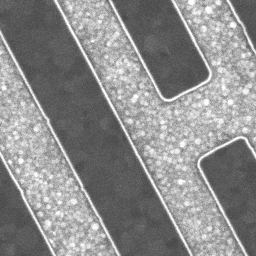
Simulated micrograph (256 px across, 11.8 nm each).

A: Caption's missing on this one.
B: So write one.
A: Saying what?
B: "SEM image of one or a few lines or trenches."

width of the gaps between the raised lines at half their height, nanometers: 566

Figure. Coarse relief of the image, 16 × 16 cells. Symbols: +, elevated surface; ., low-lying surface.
++++...++++...++
++++....++++...+
+++++...++++....
.++++....++++...
.+++++...++++...
..++++....++....
..+++++.........
...++++.........
...+++++........
....+++++....+++
+....++++....+++
+....+++++...+++
++....++++....++
++....+++++...++
+++....++++....+
+++....+++++...+